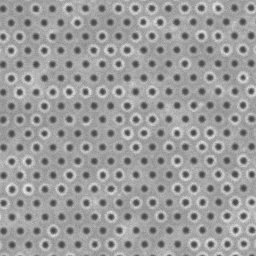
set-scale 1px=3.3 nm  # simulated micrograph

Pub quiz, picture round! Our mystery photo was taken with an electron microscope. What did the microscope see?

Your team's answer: a regular array of holes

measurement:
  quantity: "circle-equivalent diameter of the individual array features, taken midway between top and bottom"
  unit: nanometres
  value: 22.7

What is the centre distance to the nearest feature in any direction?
52.6 nanometres